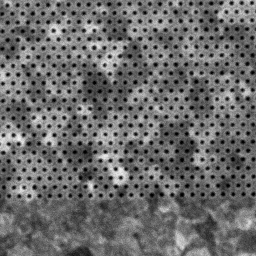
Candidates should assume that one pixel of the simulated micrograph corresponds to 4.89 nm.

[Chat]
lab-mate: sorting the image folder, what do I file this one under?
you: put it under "a regular array of holes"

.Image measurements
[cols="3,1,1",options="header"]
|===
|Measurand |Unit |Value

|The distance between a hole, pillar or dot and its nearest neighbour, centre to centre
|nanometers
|48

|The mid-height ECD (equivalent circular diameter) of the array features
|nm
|27.6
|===